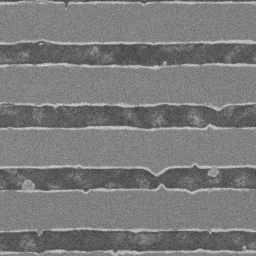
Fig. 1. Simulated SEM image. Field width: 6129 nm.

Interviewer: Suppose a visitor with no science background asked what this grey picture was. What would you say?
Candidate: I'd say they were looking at one or a few lines or trenches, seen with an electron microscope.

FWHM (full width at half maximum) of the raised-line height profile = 949 nanometers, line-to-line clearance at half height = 540 nm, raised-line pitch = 1500 nanometres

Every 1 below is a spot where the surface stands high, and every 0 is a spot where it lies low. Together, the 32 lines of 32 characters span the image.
11111111011111111111111111111111
11111111111111111111111111111111
11111111111111111111111111111111
11111111111111111111111111111111
11111111111111111111111111111111
00000000000000000000000000000000
00000000000000000000000000000000
00000000000000000000000000000000
11111111111111111111111111111111
11111111111111111111111111111111
11111111111111111111111111111111
11111111111111111111111111111111
11111111111111111111111111111111
00000000000000000000000000010000
00000000000000000000000000000000
00000000000000000000000000000000
11111111111111111111111111111111
11111111111111111111111111111111
11111111111111111111111111111111
11111111111111111111111111111111
11111111111111111111111111111111
00000000000000000001000000000000
00000000000000000000000000000000
00000000000000000000100000000000
11111111111111111111111111111111
11111111111111111111111111111111
11111111111111111111111111111111
11111111111111111111111111111111
11111111111111111111111111111111
00000000000000000000000000000000
00000000000000000000000000000000
00000111100110000011000011010000